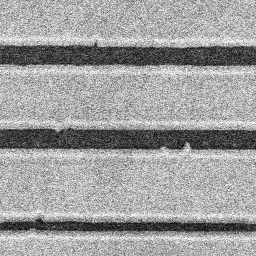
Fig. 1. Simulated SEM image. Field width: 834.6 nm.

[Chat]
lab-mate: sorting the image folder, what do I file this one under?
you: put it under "one or a few lines or trenches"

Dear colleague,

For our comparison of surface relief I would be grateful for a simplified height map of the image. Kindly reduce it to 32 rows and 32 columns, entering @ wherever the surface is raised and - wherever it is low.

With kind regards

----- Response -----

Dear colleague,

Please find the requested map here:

@@@@@@@@@@@@@@@@@@@@@@@@@@@@@@@@
@@@@@@@@@@@@@@@@@@@@@@@@@@@@@@@@
@@@@@@@@@@@@@@@@@@@@@@@@@@@@@@@@
@@@@@@@@@@@@@@@@@@@@@@@@@@@@@@@@
@@@@@@@@@@@@@@@@@@@@@@@@@@@@@@@@
--------------------------------
--------------------------------
--------------------------------
--------------------------------
@@@@@@@@@@@@@@@@@@@@@@@@@@@@@@@@
@@@@@@@@@@@@@@@@@@@@@@@@@@@@@@@@
@@@@@@@@@@@@@@@@@@@@@@@@@@@@@@@@
@@@@@@@@@@@@@@@@@@@@@@@@@@@@@@@@
@@@@@@@@@@@@@@@@@@@@@@@@@@@@@@@@
@@@@@@@@@@@@@@@@@@@@@@@@@@@@@@@@
@@@@@@@@@@@@@@@@@@@@@@@@@@@@@@@@
--------------------------------
--------------------------------
--------------------------------
@@@@@@@@@@@@@@@@@@@@@@@@@@@@@@@@
@@@@@@@@@@@@@@@@@@@@@@@@@@@@@@@@
@@@@@@@@@@@@@@@@@@@@@@@@@@@@@@@@
@@@@@@@@@@@@@@@@@@@@@@@@@@@@@@@@
@@@@@@@@@@@@@@@@@@@@@@@@@@@@@@@@
@@@@@@@@@@@@@@@@@@@@@@@@@@@@@@@@
@@@@@@@@@@@@@@@@@@@@@@@@@@@@@@@@
@@@@@@@@@@@@@@@@@@@@@@@@@@@@@@@@
--------------------------------
--------------------------------
@@@@@@@@@@@@@@-@--@@@@@@-@@@@@@@
@@@@@@@@@@@@@@@@@@@@@@@@@@@@@@@@
@@@@@@@@@@@@@@@@@@@@@@@@@@@@@@@@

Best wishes